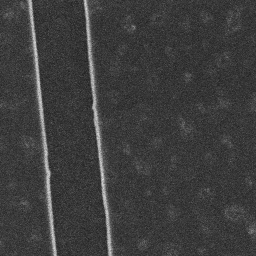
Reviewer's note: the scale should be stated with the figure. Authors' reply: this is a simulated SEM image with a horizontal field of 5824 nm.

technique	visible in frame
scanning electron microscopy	one or a few lines or trenches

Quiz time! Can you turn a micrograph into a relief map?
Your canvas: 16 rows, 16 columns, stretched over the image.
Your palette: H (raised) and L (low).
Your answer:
HHLLLHHHHHHHHHHH
HHLLLHHHHHHHHHHH
HHLLLLHHHHHHHHHH
HHLLLLHHHHHHHHHH
HHLLLLHHHHHHHHHH
HHLLLLHHHHHHHHHH
HHHLLLHHHHHHHHHH
HHHLLLHHHHHHHHHH
HHHLLLHHHHHHHHHH
HHHLLLHHHHHHHHHH
HHHLLLHHHHHHHHHH
HHHLLLHHHHHHHHHH
HHHLLLLHHHHHHHHH
HHHLLLLHHHHHHHHH
HHHLLLLHHHHHHHHH
HHHLLLLHHHHHHHHH